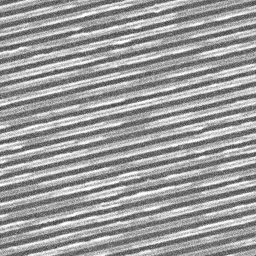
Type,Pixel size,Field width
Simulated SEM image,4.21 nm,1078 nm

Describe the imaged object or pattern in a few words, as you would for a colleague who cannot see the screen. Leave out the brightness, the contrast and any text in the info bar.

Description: parallel lines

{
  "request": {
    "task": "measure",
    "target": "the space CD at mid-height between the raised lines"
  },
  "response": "23.1 nanometers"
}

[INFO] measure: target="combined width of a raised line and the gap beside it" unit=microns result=0.0476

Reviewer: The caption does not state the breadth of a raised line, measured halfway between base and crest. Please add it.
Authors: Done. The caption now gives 23.1 nm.